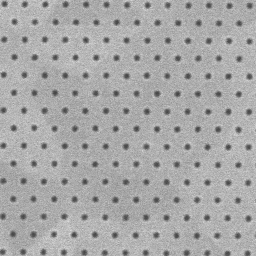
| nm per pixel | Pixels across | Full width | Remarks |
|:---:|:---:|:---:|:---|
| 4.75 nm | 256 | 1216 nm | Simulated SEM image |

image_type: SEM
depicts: a regular array of holes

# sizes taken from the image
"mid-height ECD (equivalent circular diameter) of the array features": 32.6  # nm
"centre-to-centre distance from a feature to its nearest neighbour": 94.6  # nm